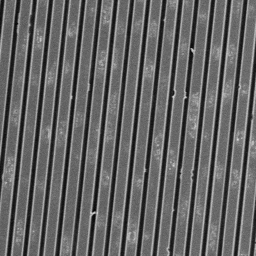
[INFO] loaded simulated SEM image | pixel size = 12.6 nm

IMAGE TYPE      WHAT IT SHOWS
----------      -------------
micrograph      parallel lines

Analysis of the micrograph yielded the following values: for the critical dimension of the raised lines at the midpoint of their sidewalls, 11.7 pixels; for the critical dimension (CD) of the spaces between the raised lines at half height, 0.0611 microns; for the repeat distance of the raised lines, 203 nm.